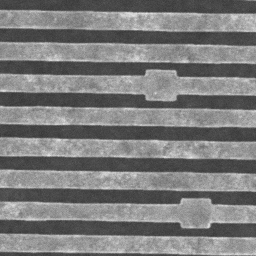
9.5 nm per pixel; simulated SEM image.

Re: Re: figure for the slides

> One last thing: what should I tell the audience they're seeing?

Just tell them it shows wiring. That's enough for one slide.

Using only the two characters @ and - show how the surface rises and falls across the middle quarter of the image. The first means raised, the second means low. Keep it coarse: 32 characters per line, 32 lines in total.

--------------------------------
--------------------------------
--------------------@@@@@@@@----
@@@@@@@@@@@@@@@@@@@@@@@@@@@@@---
@@@@@@@@@@@@@@@@@@@@@@@@@@@@@@@@
@@@@@@@@@@@@@@@@@@@@@@@@@@@@@@@@
@@@@@@@@@@@@@@@@@@@@@@@@@@@@@@@@
--------------------@@@@@@@@@---
---------------------@@@@@@@----
--------------------------------
--------------------------------
@@@@@@@@@@@@@@@@@@@@@@@@@@@@@@@@
@@@@@@@@@@@@@@@@@@@@@@@@@@@@@@@@
@@@@@@@@@@@@@@@@@@@@@@@@@@@@@@@@
@@@@@@@@@@@@@@@@@@@@@@@@@@@@@@@@
--------------------------------
--------------------------------
--------------------------------
--------------------------------
@@@@@@@@@@@@@@@@@@@@@@@@@@@@@@@@
@@@@@@@@@@@@@@@@@@@@@@@@@@@@@@@@
@@@@@@@@@@@@@@@@@@@@@@@@@@@@@@@@
@@@@@@@@@@@@@@@@@@@@@@@@@@@@@@@@
------------------------------@@
--------------------------------
--------------------------------
--------------------------------
@@@@@@@@@@@@@@@@@@@@@@@@@@@@@@@@
@@@@@@@@@@@@@@@@@@@@@@@@@@@@@@@@
@@@@@@@@@@@@@@@@@@@@@@@@@@@@@@@@
@@@@@@@@@@@@@@@@@@@@@@@@@@@@@@@@
----------------------------@@@@